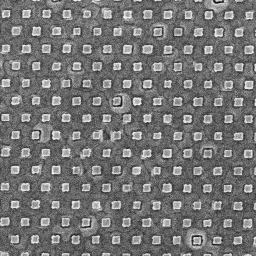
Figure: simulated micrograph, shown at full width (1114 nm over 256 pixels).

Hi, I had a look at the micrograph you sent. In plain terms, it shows a regular array of raised bodies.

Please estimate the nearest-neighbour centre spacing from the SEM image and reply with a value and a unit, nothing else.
0.0862 um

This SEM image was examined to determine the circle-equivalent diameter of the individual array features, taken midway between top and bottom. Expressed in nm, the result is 36.4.